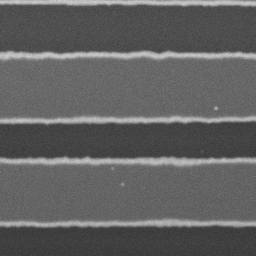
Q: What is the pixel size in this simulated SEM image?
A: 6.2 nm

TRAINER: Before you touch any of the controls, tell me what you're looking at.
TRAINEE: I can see lines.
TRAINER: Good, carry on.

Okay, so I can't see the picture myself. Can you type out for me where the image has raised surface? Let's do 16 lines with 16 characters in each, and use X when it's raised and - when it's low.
----------------
----------------
----------------
XXXXXXXXXXXXXXXX
XXXXXXXXXXXXXXXX
XXXXXXXXXXXXXXXX
XXXXXXXXXXXXXXXX
XXXXXXXXXXXXXXXX
----------------
----------------
XXXXXXXXXXXXXXXX
XXXXXXXXXXXXXXXX
XXXXXXXXXXXXXXXX
XXXXXXXXXXXXXXXX
----------------
----------------